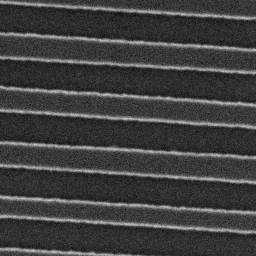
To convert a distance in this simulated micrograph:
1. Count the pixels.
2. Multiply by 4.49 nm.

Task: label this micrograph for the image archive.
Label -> lines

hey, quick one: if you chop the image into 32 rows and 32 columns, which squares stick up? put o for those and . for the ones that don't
...ooooooooooooooooooooooooooooo
.................ooooooooooooooo
................................
................................
ooooo...........................
ooooooooooooooooooooo...........
oooooooooooooooooooooooooooooooo
.....ooooooooooooooooooooooooooo
....................oooooooooooo
................................
................................
oooooooo........................
oooooooooooooooooooooooo........
oooooooooooooooooooooooooooooooo
..........oooooooooooooooooooooo
........................oooooooo
................................
................................
oooooooooooo....................
oooooooooooooooooooooooooooooo..
oooooooooooooooooooooooooooooooo
............oooooooooooooooooooo
..........................oooooo
................................
................................
oooooooooooooo..................
ooooooooooooooooooooooooooooooo.
......oooooooooooooooooooooooooo
......................oooooooooo
................................
................................
ooooooooo.......................